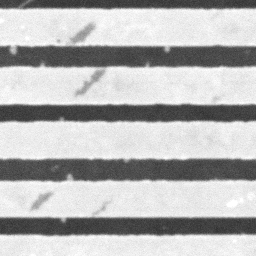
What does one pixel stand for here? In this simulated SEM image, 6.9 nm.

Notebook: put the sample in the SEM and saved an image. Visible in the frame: lines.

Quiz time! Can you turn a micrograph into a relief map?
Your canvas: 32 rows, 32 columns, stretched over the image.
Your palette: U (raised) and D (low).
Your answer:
DDDDDDDDDDDDDDDDDDDDDDDDDDDDDDDD
UUUUUUUUUUUUUUUUUUUUUUUUUUUUUUUU
UUUUUUUUUUUUUUUUUUUUUUUUUUUUUUUU
UUUUUUUUUUUUUUUUUUUUUUUUUUUUUUUU
UUUUUUUUUUUUUUUUUUUUUUUUUUUUUUUU
UUUUUUUUUUUUUUUUUUUUUUUUUUUUUUUU
DDDDDDDDDDDDDDDDDDDDDDDDDDDDDDDD
DDDDDDDDDDDDDDDDDDDDDDDDDDDDDDDD
UUUUDUUUDUUDDUUUDDDUUUUUUDDUUDUU
UUUUUUUUUUUUUUUUUUUUUUUUUUUUUUUU
UUUUUUUUUUUUUUUUUUUUUUUUUUUUUUUU
UUUUUUUUUUUUUUUUUUUUUUUUUUUUUUUU
UUUUUUUUUUUUUUUUUUUUUUUUUUUUUUUU
DDDDDDDDDDDDDDDDDDDDDDDDDDDDDDDD
DDDDDDDDDDDDDDDDDDDDDDDDDDDDDDDD
UUUUUUUUUUUUUUUUUUUUUUUUUUUUUUUU
UUUUUUUUUUUUUUUUUUUUUUUUUUUUUUUU
UUUUUUUUUUUUUUUUUUUUUUUUUUUUUUUU
UUUUUUUUUUUUUUUUUUUUUUUUUUUUUUUU
UUUUUUUUUUUUUUUUUUUUUUUUUUUUUUUU
DDDDDDDDDDDDDDDDDDDDDDDDDDDDDDDD
DDDDDDDDDDDDDDDDDDDDDDDDDDDDDDDD
DDDDDDDDDDDDDDDDDDDDDDDDDDDDDDDD
UUUUUUUUUUUUUUUUUUUUUUUUUUUUUUUU
UUUUUUUUUUUUUUUUUUUUUUUUUUUUUUUU
UUUUUUUUUUUUUUUUUUUUUUUUUUUUUUUU
UUUUUUUUUUUUUUUUUUUUUUUUUUUUUUUU
DDDDDDDDDDDDDDDDDDDDDDDDDDDDDDDD
DDDDDDDDDDDDDDDDDDDDDDDDDDDDDDDD
UUUUUUUUUUUUUUUUUUUUUUUUUUUUUUUU
UUUUUUUUUUUUUUUUUUUUUUUUUUUUUUUU
UUUUUUUUUUUUUUUUUUUUUUUUUUUUUUUU